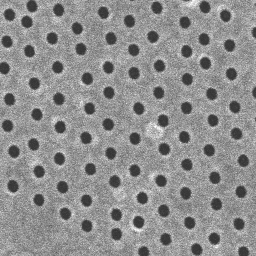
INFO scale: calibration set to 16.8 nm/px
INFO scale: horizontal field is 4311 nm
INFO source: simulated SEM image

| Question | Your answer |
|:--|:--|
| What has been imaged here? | a regular array of holes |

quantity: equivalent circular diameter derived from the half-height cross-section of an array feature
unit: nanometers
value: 210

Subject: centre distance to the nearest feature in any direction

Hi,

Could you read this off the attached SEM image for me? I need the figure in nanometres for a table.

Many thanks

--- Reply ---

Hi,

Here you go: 429